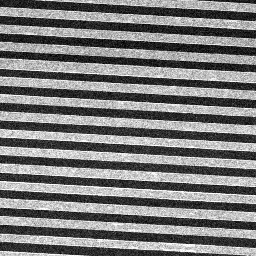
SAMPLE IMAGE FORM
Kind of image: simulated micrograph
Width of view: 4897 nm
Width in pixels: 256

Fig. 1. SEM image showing parallel lines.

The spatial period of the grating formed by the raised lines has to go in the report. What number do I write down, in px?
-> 17.4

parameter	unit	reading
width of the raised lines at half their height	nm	160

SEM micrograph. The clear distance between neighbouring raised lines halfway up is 172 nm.